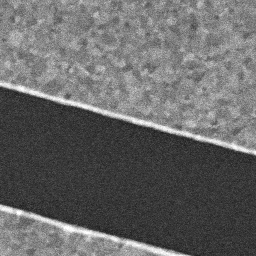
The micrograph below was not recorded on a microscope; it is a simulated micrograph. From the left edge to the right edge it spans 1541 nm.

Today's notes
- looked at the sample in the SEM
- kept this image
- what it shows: one or a few lines or trenches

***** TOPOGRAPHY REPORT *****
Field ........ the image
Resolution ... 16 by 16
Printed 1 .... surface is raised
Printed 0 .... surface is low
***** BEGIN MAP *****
1111111111111111
1111111111111111
1111111111111111
1111111111111111
1111111111111111
0111111111111111
0000011111111111
0000000011111111
0000000000001111
0000000000000000
0000000000000000
0000000000000000
0000000000000000
1100000000000000
1111100000000000
1111111110000000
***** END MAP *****